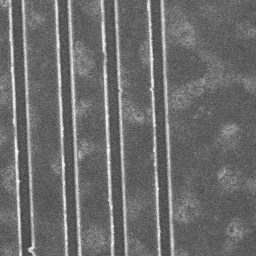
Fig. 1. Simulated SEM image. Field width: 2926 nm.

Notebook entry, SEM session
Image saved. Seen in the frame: parallel lines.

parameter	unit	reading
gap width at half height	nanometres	127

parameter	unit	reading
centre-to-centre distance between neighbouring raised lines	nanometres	529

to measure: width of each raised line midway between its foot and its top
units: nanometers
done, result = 402